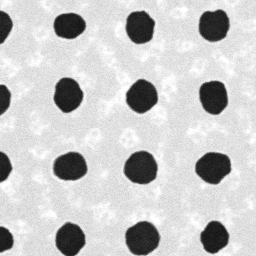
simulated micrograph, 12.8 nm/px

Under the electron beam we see a regular array of holes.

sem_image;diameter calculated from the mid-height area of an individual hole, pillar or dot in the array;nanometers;412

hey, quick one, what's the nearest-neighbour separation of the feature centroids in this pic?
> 896 nm